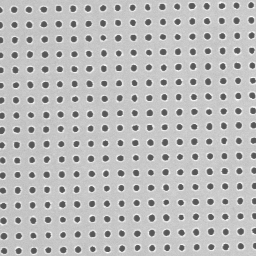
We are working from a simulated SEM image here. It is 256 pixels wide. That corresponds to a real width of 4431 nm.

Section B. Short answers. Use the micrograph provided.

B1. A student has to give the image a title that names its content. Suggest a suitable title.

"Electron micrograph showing a regular array of holes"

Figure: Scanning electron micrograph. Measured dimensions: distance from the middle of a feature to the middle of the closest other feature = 251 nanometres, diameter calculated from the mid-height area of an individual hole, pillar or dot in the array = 105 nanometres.